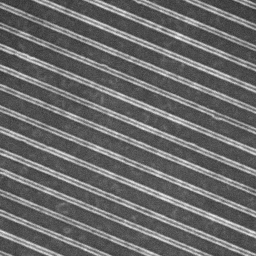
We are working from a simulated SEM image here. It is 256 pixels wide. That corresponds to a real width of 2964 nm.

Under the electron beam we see parallel lines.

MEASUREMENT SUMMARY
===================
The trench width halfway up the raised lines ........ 15.4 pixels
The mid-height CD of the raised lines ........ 41.4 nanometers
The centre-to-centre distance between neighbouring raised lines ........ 0.223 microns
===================